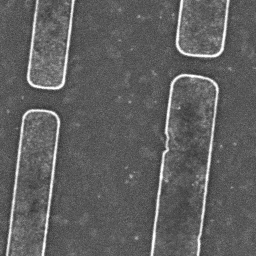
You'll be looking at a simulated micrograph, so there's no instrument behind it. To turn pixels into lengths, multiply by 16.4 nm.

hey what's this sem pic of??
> one or a few lines or trenches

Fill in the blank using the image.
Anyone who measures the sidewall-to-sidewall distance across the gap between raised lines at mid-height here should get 1770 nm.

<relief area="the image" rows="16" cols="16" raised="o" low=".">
..ooo......ooo..
..oo.......ooo..
..oo.......ooo..
..oo............
..oo............
...........ooo..
...........ooo..
.ooo......ooo...
.ooo......ooo...
.oo.......ooo...
.oo.......ooo...
.oo.......ooo...
.oo.......ooo...
.oo.......ooo...
.oo.......ooo...
ooo.......oo....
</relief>